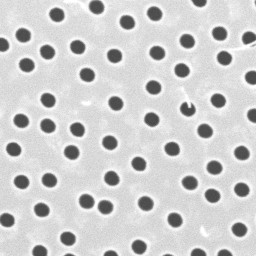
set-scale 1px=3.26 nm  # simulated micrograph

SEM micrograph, a regular array of holes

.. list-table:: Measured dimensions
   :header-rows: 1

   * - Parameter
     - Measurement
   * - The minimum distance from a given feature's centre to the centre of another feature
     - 95.5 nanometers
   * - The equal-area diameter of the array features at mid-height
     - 47.9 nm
